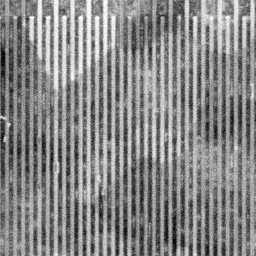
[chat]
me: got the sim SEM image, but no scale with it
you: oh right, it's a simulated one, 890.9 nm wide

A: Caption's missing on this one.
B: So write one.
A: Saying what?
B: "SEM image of parallel lines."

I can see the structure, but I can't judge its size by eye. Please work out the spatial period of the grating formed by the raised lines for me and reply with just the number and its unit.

0.0285 µm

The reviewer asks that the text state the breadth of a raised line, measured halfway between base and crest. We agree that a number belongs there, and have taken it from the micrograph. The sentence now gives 9.6 nm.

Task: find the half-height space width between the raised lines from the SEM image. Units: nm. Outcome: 19.2